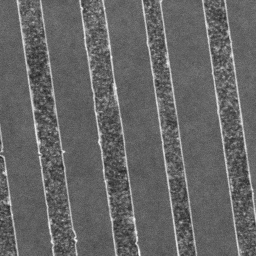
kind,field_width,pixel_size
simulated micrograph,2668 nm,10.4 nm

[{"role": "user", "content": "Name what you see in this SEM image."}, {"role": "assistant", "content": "one or a few lines or trenches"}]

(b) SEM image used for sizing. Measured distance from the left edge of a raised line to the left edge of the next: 634 nm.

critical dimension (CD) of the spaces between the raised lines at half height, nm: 401